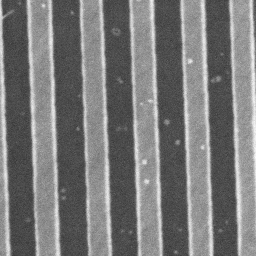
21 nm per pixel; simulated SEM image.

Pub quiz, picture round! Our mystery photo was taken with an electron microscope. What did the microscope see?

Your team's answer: lines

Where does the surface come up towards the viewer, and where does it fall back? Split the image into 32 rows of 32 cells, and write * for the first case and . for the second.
...***....***...***....***...***
....**....***...***....***...***
....**....***...***....***...***
....**....***...***....***...***
....**....***...***....***...***
....***...***...***....***...***
....***...***...***....***...***
....***...***....**....***...***
....***...***....**....***...***
....***...***....**....***...***
....***...***....**....***...***
*...***...***....***...***...***
*...***...***....***...***...***
*...***....**....***...***...***
*...***....**....***...***...***
*...***....**....***...***...***
*...***....**....***...***...***
*...***....**....***...***...***
*...***....**....***...***...***
*...***....**....***...***...***
*...***....**....***...***...***
*...***....***...***...***....**
*...***....***...***...***....**
*...***....***...***...***....**
*...***....***...***...***....**
*...***....***...***....**....**
*...***....***...***....**....**
*...***....***...***....**....**
*...***....***...***....**....**
*...***....***...***....**....**
*....**....***...***....***...**
*....**....***...***....***...**